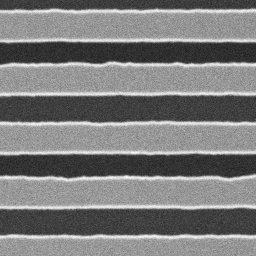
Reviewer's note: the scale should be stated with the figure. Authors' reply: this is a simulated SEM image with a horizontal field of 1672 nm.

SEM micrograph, lines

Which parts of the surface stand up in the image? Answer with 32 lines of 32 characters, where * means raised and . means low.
................................
********************************
********************************
********************************
********************************
................................
................................
................................
********************************
********************************
********************************
********************************
................................
................................
................................
********************************
********************************
********************************
********************************
................................
................................
................................
********************************
********************************
********************************
********************************
................................
................................
................................
**********.**********.**********
********************************
********************************